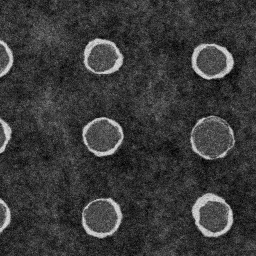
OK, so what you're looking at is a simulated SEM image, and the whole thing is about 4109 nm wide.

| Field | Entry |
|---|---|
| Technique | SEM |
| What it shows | raised bodies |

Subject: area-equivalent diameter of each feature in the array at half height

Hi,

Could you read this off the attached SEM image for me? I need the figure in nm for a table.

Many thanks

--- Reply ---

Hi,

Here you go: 582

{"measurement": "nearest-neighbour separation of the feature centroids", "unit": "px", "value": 78.4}